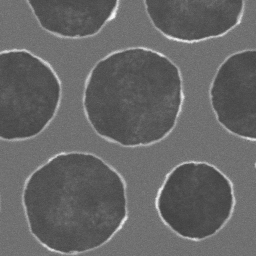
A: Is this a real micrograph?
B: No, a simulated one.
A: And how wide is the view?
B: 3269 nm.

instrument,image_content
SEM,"holes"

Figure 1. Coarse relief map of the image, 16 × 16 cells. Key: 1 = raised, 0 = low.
1100000110000001
1110001111000001
1111111111111111
0011111000111110
0001110000011100
0000100000011000
0000100000011000
0001110000011100
0011110000111110
1111111111111111
1110000111100111
1100000011000011
1100000011000011
1100000011000011
1100000111100111
1110001111111111